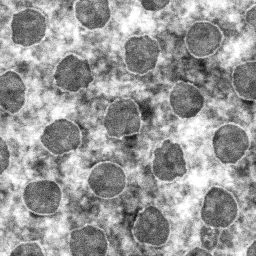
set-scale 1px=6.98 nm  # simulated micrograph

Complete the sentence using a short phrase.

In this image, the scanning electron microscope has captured a regular array of raised bodies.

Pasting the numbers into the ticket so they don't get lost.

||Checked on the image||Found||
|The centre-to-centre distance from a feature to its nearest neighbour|443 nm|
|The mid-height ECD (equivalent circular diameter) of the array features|270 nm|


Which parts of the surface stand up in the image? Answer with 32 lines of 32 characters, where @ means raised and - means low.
---------@@@@@----@@@-----------
--@@@----@@@@@-----------------@
-@@@@@----@@@@-----------------@
-@@@@@-----@@-----------@@@----@
-@@@@@-----------@@----@@@@@----
--@@@----------@@@@@---@@@@@----
----------------@@@@----@@@-----
--------@@@-----@@@@------------
-------@@@@-----@@@----------@@@
@@@----@@@@@-----------------@@@
@@@----@@@@-----------@@-----@@@
@@@------@-----------@@@@-----@@
@@@------------@@----@@@@@-----@
@@@----------@@@@----@@@@-------
-------------@@@@@----@@--------
------@@@----@@@@@----------@---
-----@@@@@---@@@@----------@@@@-
@----@@@@@----------------@@@@@-
@-----@@@@----------@@@----@@@@-
@------------------@@@@----@@@--
@-----------@@-----@@@@-----@---
@----------@@@@@---@@@@---------
-----@-----@@@@@----@@----------
---@@@@@---@@@@@----------@@----
---@@@@@----@@@-----------@@@---
---@@@@------------------@@@@@--
----@@@-----------@@-----@@@@@--
-----------------@@@@----@@@@---
----------@@-----@@@@----@@@----
---------@@@@----@@@@----@@-----
--@@@----@@@@@----@@-----@@----@
-@@@@----@@@@----------@@@@----@